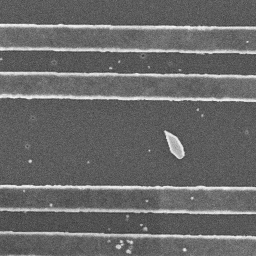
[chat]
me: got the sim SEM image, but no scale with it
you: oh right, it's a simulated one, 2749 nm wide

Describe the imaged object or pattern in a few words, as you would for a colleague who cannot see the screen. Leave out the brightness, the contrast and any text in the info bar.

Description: lines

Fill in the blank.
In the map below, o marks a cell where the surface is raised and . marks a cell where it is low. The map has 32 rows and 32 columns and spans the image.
................................
................................
................................
ooooooooooooooooooooooooooooooo.
oooooooooooooooooooooooooooooooo
oooooooooooooooooooooooooooooooo
.......................ooooooooo
................................
................................
ooooooooooooooooooooooooooo.....
oooooooooooooooooooooooooooooooo
oooooooooooooooooooooooooooooooo
......................o..o.ooooo
................................
................................
................................
................................
.....................o..........
.....................oo.........
......................o.........
................................
................................
................................
oooooooooooooooooooooooooooo....
oooooooooooooooooooooooooooooooo
oooooooooooooooooooooooooooooooo
.......................ooooooooo
................................
................................
oooooooooooooooooooo.oo.........
oooooooooooooooooooooooooooooooo
oooooooooooooooooooooooooooooooo